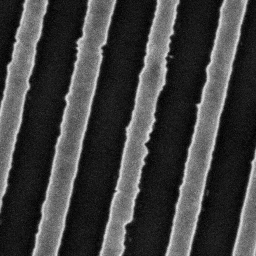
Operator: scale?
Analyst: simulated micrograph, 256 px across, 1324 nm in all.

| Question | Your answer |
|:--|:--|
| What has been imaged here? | one or a few lines or trenches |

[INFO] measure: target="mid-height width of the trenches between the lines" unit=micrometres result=0.221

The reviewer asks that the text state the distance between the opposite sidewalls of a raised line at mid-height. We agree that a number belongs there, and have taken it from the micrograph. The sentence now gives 0.113 micrometres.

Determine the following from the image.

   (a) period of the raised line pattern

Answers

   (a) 0.334 µm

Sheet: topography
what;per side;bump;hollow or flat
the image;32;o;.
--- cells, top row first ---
...ooo.....ooo......oo......ooo.
...ooo.....ooo......oo......ooo.
...oo......ooo.....ooo......oo..
..ooo.....oooo.....ooo.....ooo..
..ooo.....ooo......oo......ooo..
..ooo.....ooo.....ooo......ooo..
..oo......ooo.....ooo......oo...
..oo......ooo.....ooo.....ooo...
.ooo.....ooo......ooo.....ooo...
.ooo.....ooo......ooo.....ooo...
.ooo.....ooo.....ooo......oo....
.oo......ooo.....ooo.....ooo....
ooo.....oooo.....ooo.....ooo....
ooo.....ooo......oo......ooo....
ooo.....ooo......oo......oo.....
ooo.....ooo.....ooo......oo.....
oo......ooo.....ooo.....ooo.....
oo.....ooo......oo......ooo.....
oo.....ooo......oo......ooo.....
o......ooo.....ooo......oo......
o......ooo.....ooo.....ooo......
o.....oooo.....ooo.....ooo.....o
o.....ooo......oo......ooo.....o
o.....ooo......oo......ooo.....o
......ooo.....ooo.....ooo......o
......ooo.....ooo.....ooo......o
.....ooo......ooo.....ooo.....oo
.....ooo......oo......ooo.....oo
.....ooo.....ooo......oo......oo
.....ooo.....ooo.....ooo......oo
....ooo......oo......ooo.....ooo
....ooo......oo......ooo.....ooo